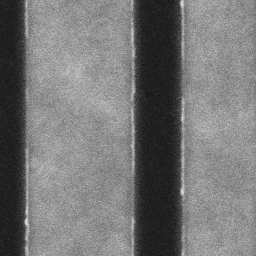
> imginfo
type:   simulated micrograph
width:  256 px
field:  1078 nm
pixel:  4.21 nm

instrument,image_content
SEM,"one or a few lines or trenches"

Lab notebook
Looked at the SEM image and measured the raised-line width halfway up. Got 219 nm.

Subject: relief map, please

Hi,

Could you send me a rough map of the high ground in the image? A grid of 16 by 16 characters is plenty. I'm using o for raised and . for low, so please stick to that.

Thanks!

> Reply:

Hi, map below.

oo......ooo.....
oo......ooo.....
oo......ooo.....
oo......ooo.....
oo......ooo.....
oo......ooo.....
oo......ooo.....
oo......ooo.....
oo......ooo.....
oo......ooo.....
oo......ooo.....
oo......ooo.....
oo......ooo.....
oo......ooo.....
oo......ooo.....
oo......ooo.....